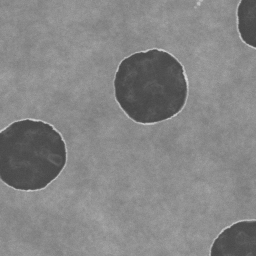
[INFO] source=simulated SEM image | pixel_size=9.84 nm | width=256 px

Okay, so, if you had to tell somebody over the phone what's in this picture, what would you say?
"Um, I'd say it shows holes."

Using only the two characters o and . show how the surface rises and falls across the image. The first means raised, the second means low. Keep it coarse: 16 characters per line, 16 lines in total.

ooooooooooooooo.
ooooooooooooooo.
ooooooooooooooo.
oooooooo...ooooo
ooooooo....ooooo
ooooooo.....oooo
ooooooo....ooooo
oooooooo..oooooo
....oooooooooooo
....oooooooooooo
....oooooooooooo
...ooooooooooooo
oooooooooooooooo
oooooooooooooooo
oooooooooooooo..
ooooooooooooo...